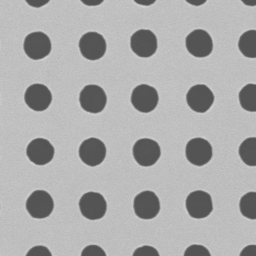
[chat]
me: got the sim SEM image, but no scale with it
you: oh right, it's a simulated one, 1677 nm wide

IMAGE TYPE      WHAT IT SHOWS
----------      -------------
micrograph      a regular array of holes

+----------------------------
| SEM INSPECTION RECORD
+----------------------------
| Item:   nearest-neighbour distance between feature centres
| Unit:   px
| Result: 52.3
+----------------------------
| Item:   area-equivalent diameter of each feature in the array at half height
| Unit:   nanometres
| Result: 180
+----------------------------